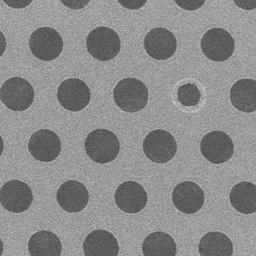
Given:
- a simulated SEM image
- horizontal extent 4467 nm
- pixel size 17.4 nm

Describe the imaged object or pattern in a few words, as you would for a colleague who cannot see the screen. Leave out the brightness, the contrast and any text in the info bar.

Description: a regular array of holes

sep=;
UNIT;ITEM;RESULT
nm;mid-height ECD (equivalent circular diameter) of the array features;596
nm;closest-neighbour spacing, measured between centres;1000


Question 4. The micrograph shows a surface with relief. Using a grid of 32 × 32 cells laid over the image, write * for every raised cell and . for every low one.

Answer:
*...****...****...****...****...
********************************
********************************
*****..*****..*****..******.****
.***....***....***....***....***
.***....***....***....***....***
.***....***....***....***....***
*****..*****..******.*****..****
********************************
********************************
....****...****...*****.*****...
....***....***....****...****...
....***....***....****...****...
*...****...****...***********...
********************************
********************************
****...****...*****..*****..****
****...****....***....***....***
***.....***....***....***....***
****...****....***....***....***
********************************
********************************
*.******************************
....***....****...****...****...
....***....***....***.....***...
....***....****...****...****...
*..*****..*****..******..*****..
********************************
********************************
****...****...****...****...****
****....**.....***....***....***
****....**.....***....***....***